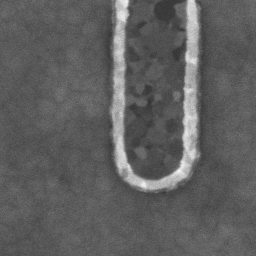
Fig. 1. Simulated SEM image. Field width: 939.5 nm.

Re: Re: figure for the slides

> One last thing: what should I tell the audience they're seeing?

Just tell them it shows one or a few lines or trenches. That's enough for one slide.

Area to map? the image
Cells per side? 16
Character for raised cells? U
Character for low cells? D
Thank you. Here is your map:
DDDDDDDDUUUUDDDD
DDDDDDDDUUUUDDDD
DDDDDDDUUUUUDDDD
DDDDDDDUUUUUDDDD
DDDDDDDUUUUUDDDD
DDDDDDDUUUUUDDDD
DDDDDDDUUUUUDDDD
DDDDDDDUUUUUDDDD
DDDDDDDUUUUUDDDD
DDDDDDDUUUUUDDDD
DDDDDDDDUUUUDDDD
DDDDDDDDDUDDDDDD
DDDDDDDDDDDDDDDD
DDDDDDDDDDDDDDDD
DDDDDDDDDDDDDDDD
DDDDDDDDDDDDDDDD